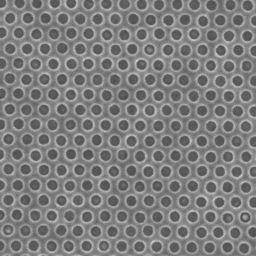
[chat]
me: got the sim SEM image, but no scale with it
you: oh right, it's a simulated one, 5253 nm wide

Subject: a regular array of holes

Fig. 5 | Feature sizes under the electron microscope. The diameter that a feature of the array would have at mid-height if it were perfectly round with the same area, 0.225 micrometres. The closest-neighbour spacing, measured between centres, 346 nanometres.